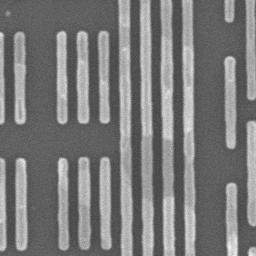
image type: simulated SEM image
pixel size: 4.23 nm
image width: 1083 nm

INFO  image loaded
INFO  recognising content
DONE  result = wiring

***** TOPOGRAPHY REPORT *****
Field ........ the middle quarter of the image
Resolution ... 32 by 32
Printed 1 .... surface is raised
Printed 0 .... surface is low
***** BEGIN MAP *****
00001100011000110001110011100011
00011100011000110000110011100011
00011100011000110000110011100011
10011100011000110000110011100011
10011100011000110000110011100011
10011100011000110000110011100011
10011100011000110000110001100011
10001100011000110000110001100011
10001100011000110000110001100011
10001100011000110000110001100011
10001100011000110000110001100011
10001100011000110000110001100011
10001100011000110000110001100011
10001100011000110000110001100011
00001100001000110000110001100011
00000000000000110000110001100011
00000000000000110000110001100011
00000000000000110000110001100011
00000000000000110000110001100011
00000000000000110000110001100011
00000000000000111000110001100011
00000000000000111000110001100011
00000000000000111000110001100011
00000000000000111000110001100011
10001100011000111000110001100011
10001100011000111000110001100011
10001100011000111000110001100011
10001100011000111000110001100011
10001100011000111000110001100011
10001100011000111000110001100011
10001100011000111000110001100011
10001100011000111000110001100011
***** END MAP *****